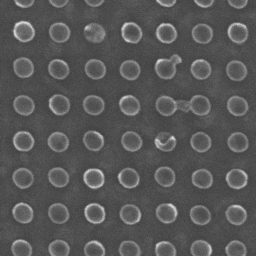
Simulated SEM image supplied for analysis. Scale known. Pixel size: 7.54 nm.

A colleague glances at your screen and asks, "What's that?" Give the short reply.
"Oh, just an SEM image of a regular array of raised bodies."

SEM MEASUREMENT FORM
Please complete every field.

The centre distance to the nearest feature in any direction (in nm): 264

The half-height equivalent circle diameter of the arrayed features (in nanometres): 151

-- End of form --